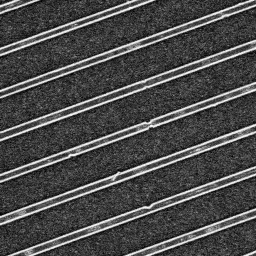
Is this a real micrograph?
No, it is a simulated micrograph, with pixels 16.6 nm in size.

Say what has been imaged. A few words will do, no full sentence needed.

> parallel lines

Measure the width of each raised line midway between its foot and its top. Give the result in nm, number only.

113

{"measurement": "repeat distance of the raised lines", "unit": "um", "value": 0.659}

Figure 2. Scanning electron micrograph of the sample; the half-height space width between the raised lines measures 537 nm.